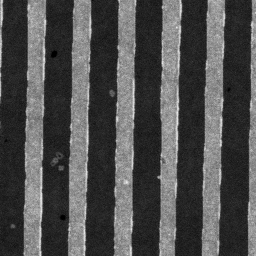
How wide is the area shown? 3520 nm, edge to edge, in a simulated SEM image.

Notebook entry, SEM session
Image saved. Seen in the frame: lines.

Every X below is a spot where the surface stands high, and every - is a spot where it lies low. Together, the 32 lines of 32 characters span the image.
----XX---XX----XX---XXX---XX----
----XX---XX----XX---XXX---XX----
----XX---XX----XX---XX----XX---X
----XX---XX----XX---XX----XX---X
----XX---XX----XX---XX----XX---X
----XX---XX----XX---XX----XX---X
----XX---XX----XX---XX----XX---X
----XX---XX----XX---XX----XX---X
----X----XX----XX---XX----XX---X
---XX----XX----XX---XX----XX---X
----X----XX----XX---XX----XX---X
---XX----XX----XX---XX----XX---X
---XX----XX----XX---XX----XX---X
---XX----XX----XX---XX----XX---X
---XX----XX----XX---XX----XX---X
---XX----XX----XX---XX----XX---X
---XX----XX----XX---XX----XX---X
---XX----XX----XX---XX----XX---X
---XX----XX----XX---XX----XX---X
---XX----XX----XX---XX----XX---X
---XX----XX----XX---XX---XXX---X
---XX----XX----X----XX---XXX---X
---XX----XX----X----XX---XXX---X
---XX----XX---XX----XX---XX----X
---XX----XX---XX----XX---XX----X
---XX----XX----X----XX---XX----X
---XX----XX---XX----XX---XX----X
---XX----XX---XX----XX---XX----X
---XX----XX---XX----XX---XX----X
---XX----XX---XX----XX---XX----X
---XX----XX---XX----XX---XX----X
---XX----XX---XX----XX---XX----X